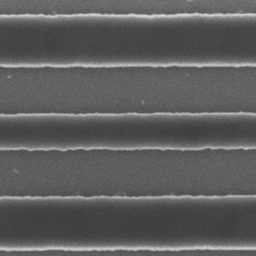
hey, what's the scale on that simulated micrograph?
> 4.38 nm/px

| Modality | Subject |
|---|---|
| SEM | lines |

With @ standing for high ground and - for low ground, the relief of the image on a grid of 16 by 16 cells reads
----------------
@@@@@@@@@@@@@@@@
@@@@@@@@@@@@@@@@
@@@@@@@@@@@@@@@@
----------------
----------------
----------------
@@@@@@@@@@@@@@@@
@@@@@@@@@@@@@@@@
----------------
----------------
----------------
@@@@@@@@@@@@@@@@
@@@@@@@@@@@@@@@@
@@@@@@@@@@@@@@@@
@@@@@@@@@@@@@@@@